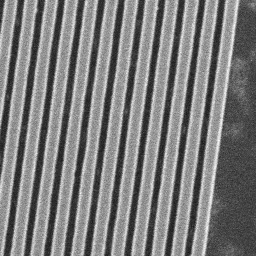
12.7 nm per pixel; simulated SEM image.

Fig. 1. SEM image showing parallel lines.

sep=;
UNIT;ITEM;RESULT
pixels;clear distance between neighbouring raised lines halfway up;7.56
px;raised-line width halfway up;12.3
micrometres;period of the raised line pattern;0.252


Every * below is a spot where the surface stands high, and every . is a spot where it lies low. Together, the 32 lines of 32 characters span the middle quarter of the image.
*..***..***..***..***..***..***.
*..***..***..***..***..***..***.
*..***..***..***..***..***..***.
*..***..***..***..***..***..***.
*..***..***..***..***..***..***.
...***..***..***..***..***..***.
..***..***..***..***..***...**..
..***..***..***..***..***..***..
..***..***..***..***..***..***..
..***..***..***..***..***..***..
..***..***..***..***..***..***..
..***..***..***..***..***..***..
..***..***..***..***..***..***..
.***..***...**...**...***..***..
.***..***..***..***..***..***..*
.***..***..***..***..***..***..*
.***..***..***..***..***..***..*
.***..***..***..***..***..***..*
.***..***..***..***..***..***..*
.***..***..***..***..***..***..*
.**...***..***..***..***..***..*
***...**..***..***..***..***...*
***...**..***..***..***..***..**
***..***..***..***..***..***..**
***..***..***..***..***..***..**
***..***..***..***..***..***..**
***..***..***..***..***..***..**
***..***.****..***..***..***..**
**..***..***...**...**...***..**
**..***..***..***..***..***..***
**..***..***..***..***..***..***
**..***..***..***..***..***..***